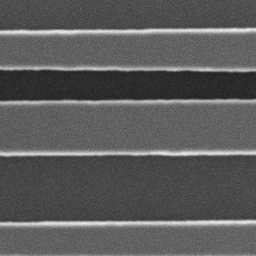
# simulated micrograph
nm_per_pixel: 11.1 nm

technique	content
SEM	lines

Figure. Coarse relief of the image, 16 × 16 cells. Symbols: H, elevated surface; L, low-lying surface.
LLLLLLLLLLLLLLLL
LLLLLLLLLLLLLLLL
HHHHHHHHHHHHHHHH
HHHHHHHHHHHHHHHH
LLLLLLLLLLLLLLLL
LLLLLLLLLLLLLLLL
HHHHHHHHHHHHHHHH
HHHHHHHHHHHHHHHH
HHHHHHHHHHHHHHHH
HHHHHHHHHHHHHHHH
LLLLLLLLLLLLLLLL
LLLLLLLLLLLLLLLL
LLLLLLLLLLLLLLLL
LLLLLLLLLLLLLLLL
HHHHHHHHHHHHHHHH
HHHHHHHHHHHHHHHH